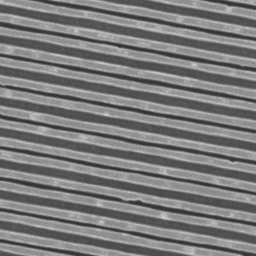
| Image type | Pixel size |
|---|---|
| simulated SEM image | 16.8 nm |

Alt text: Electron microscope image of parallel lines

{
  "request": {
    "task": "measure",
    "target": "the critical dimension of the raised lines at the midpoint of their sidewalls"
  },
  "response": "136 nm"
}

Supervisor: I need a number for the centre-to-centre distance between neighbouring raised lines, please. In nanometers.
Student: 256